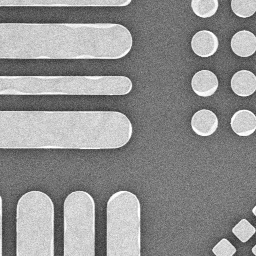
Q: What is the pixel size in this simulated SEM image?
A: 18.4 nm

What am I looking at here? groups of lines, slits or small figures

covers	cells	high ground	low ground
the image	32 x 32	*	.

****************........***..***
.........................**..***
................................
****************................
****************........***..***
****************........***..***
****************........***..***
................................
................................
........................***..***
****************........***..***
****************.........*...***
................................
................................
****************........***..***
****************........***..***
****************.........*...**.
****************................
................................
................................
................................
................................
................................
................................
...***...**...***...............
..*****.****.****...............
..*****.****.****...............
..*****.****.****...............
..*****.****.****............***
..*****.****.****.............*.
..*****.****.****..........**...
..*****.****.****..........**...